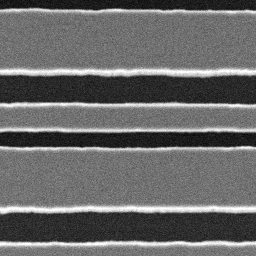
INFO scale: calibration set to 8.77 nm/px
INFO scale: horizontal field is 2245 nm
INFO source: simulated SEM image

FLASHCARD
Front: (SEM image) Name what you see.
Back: lines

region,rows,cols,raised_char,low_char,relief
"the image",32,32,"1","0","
00000000000000000000000000000000
11111111111111111111111111111111
11111111111111111111111111111111
11111111111111111111111111111111
11111111111111111111111111111111
11111111111111111111111111111111
11111111111111111111111111111111
11111111111111111111111111111111
11111111111111111111111111111111
00000000000000000000000000000000
00000000000000000000000000000000
00000000000000000000000000000000
00000000000000000000000000000000
11111111111111111111111111111111
11111111111111111111111111111111
11111111111111111111111111111111
00000000000000000000000000000000
00000000000000000000000000000000
11111111111110000001111111111111
11111111111111111111111111111111
11111111111111111111111111111111
11111111111111111111111111111111
11111111111111111111111111111111
11111111111111111111111111111111
11111111111111111111111111111111
11111111111111111111111111111111
00000000000000000000000000000000
00000000000000000000000000000000
00000000000000000000000000000000
00000000000000000000000000000000
11111111111111111101111111111011
11111111111111111111111111111111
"